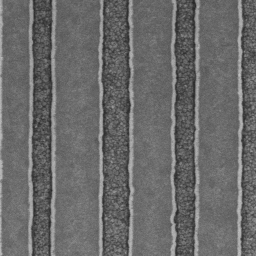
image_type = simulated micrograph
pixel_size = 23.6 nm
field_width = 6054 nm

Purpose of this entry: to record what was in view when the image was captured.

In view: one or a few lines or trenches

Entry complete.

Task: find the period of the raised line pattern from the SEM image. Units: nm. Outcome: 1670